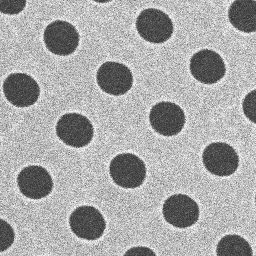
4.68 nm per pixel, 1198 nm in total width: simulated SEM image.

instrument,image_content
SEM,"a regular array of holes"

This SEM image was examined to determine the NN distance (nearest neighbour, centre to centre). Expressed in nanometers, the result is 306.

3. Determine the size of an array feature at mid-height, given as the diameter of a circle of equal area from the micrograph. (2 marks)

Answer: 168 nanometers